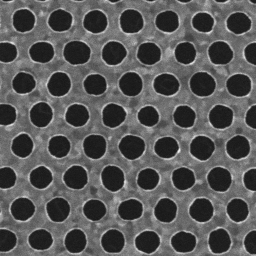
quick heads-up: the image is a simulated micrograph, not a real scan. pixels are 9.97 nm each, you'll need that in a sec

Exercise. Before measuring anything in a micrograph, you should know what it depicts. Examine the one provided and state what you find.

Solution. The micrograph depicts a regular array of holes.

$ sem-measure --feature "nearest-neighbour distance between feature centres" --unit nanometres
350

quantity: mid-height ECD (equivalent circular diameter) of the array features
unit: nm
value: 243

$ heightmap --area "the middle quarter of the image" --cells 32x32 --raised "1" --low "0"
11111111111011111111111111111111
11111111111111111111111111111111
01111110011111100011111100011111
01111100001111000001111000001111
00111000000111000000110000000110
00111000000111000000110000000110
00111000000111000001111000000111
01111100001111100001111100001111
11111111111111111111111111111111
11111111111111111111111111111111
10000111110000111111101111111001
10000011110000011110000111110000
00000011100000001100000011100000
00000011110000011100000011100000
10000011110000011110000011110000
11000111110000111111001111111000
11111111111111111111111111111111
11111110111111111111111111111111
01111000001111100001111100011111
01111000000111000000111000001111
00111000000111000000111000000110
01111000001111000000110000000110
01111000001111000000111000001111
11111110011111100001111100011111
11111111111111111111111111111111
11001111110001111111111111111111
10000111110000111110000111110000
00000011100000011110000011100000
00000011100000011100000011100000
00000011110000011100000011100000
10000111110000011110000111110000
11111111111000111111001111111001